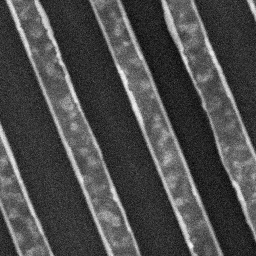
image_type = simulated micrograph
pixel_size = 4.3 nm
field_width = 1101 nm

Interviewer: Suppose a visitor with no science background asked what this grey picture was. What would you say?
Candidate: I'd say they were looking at one or a few lines or trenches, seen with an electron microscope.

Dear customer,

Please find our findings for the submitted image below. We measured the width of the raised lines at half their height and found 122 nanometers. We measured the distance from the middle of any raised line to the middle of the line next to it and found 0.318 µm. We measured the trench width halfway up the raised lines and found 205 nm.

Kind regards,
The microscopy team